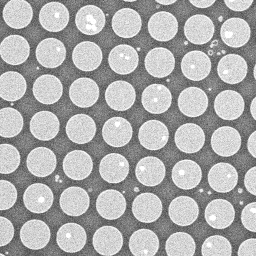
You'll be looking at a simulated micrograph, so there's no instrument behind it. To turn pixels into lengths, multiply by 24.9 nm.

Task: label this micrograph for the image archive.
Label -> an array of small figures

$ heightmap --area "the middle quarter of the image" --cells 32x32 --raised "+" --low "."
...++++++...++++++..+++++++..+++
.....++.....+++++....++++++..+++
......................++++....++
...............................+
...+++++.....++.................
..++++++...++++++....++++.......
.++++++++..++++++...++++++....++
.++++++++.++++++++..+++++++..+++
..++++++..++++++++..+++++++..+++
..++++++...++++++...+++++++..+++
....++.....++++++...++++++...+++
..............+......++++....+++
..............................++
..+++++.....++..................
.++++++....+++++.....+++........
.+++++++..+++++++...+++++....+++
.+++++++..+++++++..+++++++..++++
.+++++++..+++++++..+++++++..++++
.++++++...+++++++..+++++++..++++
...+++.....+++++...+++++++..++++
............+++.....+++++...++++
.............................+++
.+++++......+...................
+++++++...+++++.....+++.........
+++++++..+++++++...+++++.....+++
+++++++..+++++++..+++++++...++++
+++++++..+++++++..+++++++..+++++
.+++++...+++++++..+++++++..+++++
..+++.....+++++...+++++++..+++++
...........+++.....+++++...+++++
............................++++
+++++...........................